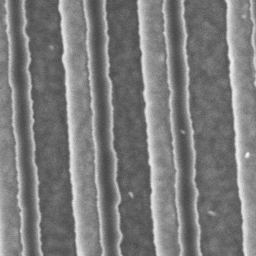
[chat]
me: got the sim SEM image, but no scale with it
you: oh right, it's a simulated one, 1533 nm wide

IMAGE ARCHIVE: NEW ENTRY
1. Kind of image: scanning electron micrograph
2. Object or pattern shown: lines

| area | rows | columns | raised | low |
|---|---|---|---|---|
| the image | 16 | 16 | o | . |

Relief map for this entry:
oo..ooo..oo...oo
oo..ooo..oo...oo
oo..ooo..ooo..oo
oo..ooo..ooo..oo
oo..ooo..ooo..oo
oo..ooo..ooo...o
oo..ooo..ooo...o
oo..ooo..ooo...o
oo..ooo..ooo...o
oo..ooo..ooo...o
oo..ooo..ooo...o
oo...oo...oo...o
oo...oo..ooo...o
oo...oo...oo...o
oo...ooo..oo...o
ooo..ooo..oo...o